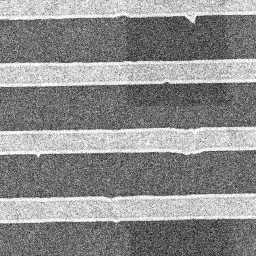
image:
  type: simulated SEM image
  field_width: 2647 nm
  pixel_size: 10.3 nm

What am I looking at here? one or a few lines or trenches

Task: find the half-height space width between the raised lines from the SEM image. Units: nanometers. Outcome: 491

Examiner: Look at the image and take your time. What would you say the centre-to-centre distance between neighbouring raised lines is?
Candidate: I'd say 701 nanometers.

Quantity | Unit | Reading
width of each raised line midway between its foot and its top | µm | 0.209